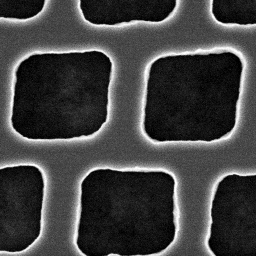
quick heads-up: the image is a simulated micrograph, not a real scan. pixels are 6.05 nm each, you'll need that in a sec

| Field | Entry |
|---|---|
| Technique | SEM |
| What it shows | holes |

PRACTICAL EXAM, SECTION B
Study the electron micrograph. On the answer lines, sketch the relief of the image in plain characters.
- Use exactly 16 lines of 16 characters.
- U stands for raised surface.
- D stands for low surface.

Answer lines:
DDDUUDDDDDDUUDDD
UUUUUUDUUUUUUUUD
UUUUUUUUUUUUUUUU
UUDDDDDUUUUDDDDU
UDDDDDDUUDDDDDDU
UDDDDDDUUDDDDDDU
UDDDDDDUUDDDDDDU
UDDDDDDUUDDDDDDU
UUDDDUUUUDDDDDUU
UUUUUUUUUUUUUUUU
DDUUUUUUUUUUUUUU
DDDUUDDDDDDUUUDD
DDDUUDDDDDDUUDDD
DDDUUDDDDDDUUDDD
DDUUUDDDDDDUUDDD
DDUUUDDDDDUUUDDD